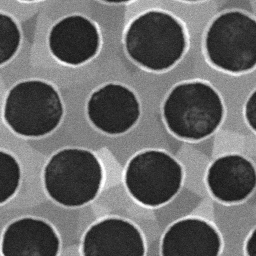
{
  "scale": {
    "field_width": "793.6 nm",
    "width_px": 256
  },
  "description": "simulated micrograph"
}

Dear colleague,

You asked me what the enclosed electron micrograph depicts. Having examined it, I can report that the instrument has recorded holes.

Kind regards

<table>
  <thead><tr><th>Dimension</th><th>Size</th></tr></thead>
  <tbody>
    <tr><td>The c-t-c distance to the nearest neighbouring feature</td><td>0.245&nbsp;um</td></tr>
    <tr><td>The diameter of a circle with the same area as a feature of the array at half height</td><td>184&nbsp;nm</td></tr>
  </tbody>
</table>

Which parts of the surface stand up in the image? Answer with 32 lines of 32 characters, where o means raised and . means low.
oooooooooooooooooooooooooooooooo
oooooooooooooooooo..oooooooo..oo
..oooooo...oooooo.....ooooo.....
..oooo......oooo.......ooo......
...ooo......oooo.......ooo......
...ooo......oooo.......ooo......
..oooo......oooo.......ooo......
.oooooo....oooooo.....oooo......
oooooooooooooooooo...oooooo.....
oooooooooooooooooooooooooooooooo
oo....ooooooo..ooooooo....oooooo
o......ooooo.....oooo......ooooo
o.......ooo......oooo.......ooo.
o.......ooo.......oo........ooo.
........ooo......ooo........ooo.
o......oooo......oooo......oooo.
oo....ooooooo...ooooo......ooooo
oooooooooooooooooooooooo.ooooooo
oooooooo..oooooooooooooooooooooo
..ooooo.....ooooo....ooooooo..oo
..oooo.......ooo......oooo......
...oo........ooo.......ooo......
...oo........ooo.......ooo......
..oooo......oooo......oooo......
..oooo......ooooo.....ooooo....o
ooooooo....ooooooo..oooooooooooo
oooooooooooooooooooooooooooooooo
oo...oooooooo...ooooooo..ooooooo
o......oooo......oooo......ooooo
.......oooo.......oo.......oooo.
.......ooo........oo........ooo.
.......ooo........oo.......oooo.